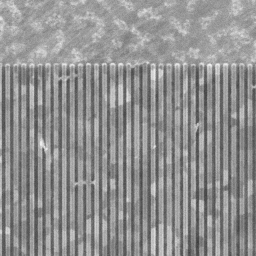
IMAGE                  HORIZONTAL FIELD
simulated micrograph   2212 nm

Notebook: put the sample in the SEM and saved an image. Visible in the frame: parallel lines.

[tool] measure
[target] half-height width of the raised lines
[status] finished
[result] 32.4 nm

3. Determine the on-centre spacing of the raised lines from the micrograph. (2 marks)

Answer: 69.8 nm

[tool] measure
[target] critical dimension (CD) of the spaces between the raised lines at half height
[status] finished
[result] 32.4 nm